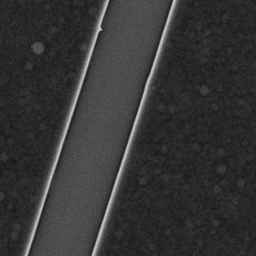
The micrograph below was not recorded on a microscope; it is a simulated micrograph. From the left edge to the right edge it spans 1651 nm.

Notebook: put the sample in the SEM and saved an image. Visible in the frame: one or a few lines or trenches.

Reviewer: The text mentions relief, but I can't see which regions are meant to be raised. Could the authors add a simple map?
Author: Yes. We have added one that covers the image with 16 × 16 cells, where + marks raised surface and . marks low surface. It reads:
+++++++....+++++
++++++....++++++
++++++....++++++
++++++....++++++
+++++....+++++++
+++++....+++++++
+++++....+++++++
++++....++++++++
++++....++++++++
++++....++++++++
+++.....++++++++
+++....+++++++++
+++....+++++++++
++.....+++++++++
++....++++++++++
++....++++++++++